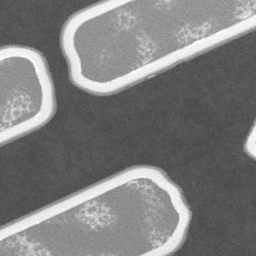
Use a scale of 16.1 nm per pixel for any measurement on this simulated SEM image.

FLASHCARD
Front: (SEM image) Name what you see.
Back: one or a few lines or trenches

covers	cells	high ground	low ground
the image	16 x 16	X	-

------XXXXXXXXXX
-----XXXXXXXXXX-
----XXXXXXXXX---
XX---XXXXXX-----
XXX--XXXX-------
XXX-------------
XXX-------------
XX--------------
----------------
----------------
----------------
-------XXX------
-----XXXXXX-----
---XXXXXXXX-----
XXXXXXXXXXX-----
XXXXXXXXXX------